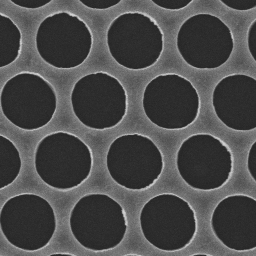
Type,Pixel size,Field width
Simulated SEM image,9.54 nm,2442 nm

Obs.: a regular array of holes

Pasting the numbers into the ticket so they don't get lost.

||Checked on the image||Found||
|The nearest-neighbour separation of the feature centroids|662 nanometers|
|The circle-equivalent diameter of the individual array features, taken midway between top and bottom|527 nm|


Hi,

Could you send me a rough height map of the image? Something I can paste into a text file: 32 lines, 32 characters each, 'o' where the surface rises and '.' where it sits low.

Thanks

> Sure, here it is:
oo....oooo.....ooooo....oooo....
oooooooooooooooooooooooooooooooo
.ooooo....oooo.....oooo.....oooo
..ooo......ooo......ooo.....ooo.
...oo......oo.......oo.......oo.
..ooo......ooo......oo.......oo.
..ooo......ooo......oo.......oo.
..oooo.....ooo......ooo.....oooo
oooooooooooooooo..oooooooooooooo
oo...oooooo...oooooo..ooooooo..o
o.....oooo.....oooo.....ooo.....
.......oo.......oo.......oo.....
.......oo.......oo.......oo.....
.......oo.......oo.......oo.....
o......ooo.....ooo......ooo.....
oo....ooooo...ooooo.....oooo....
oooooooooooooooooooooooooooooooo
.oooo.....oooo.....oooo....ooooo
..ooo......ooo......ooo.....ooo.
..oo.......oo.......oo.......oo.
...o.......oo.......oo.......oo.
..ooo......ooo......oo.......oo.
..ooo.....oooo.....oooo.....oooo
ooooooo..ooooooo..ooooooo..ooooo
oo...oooooo..ooooooo..ooooooo..o
o.....oooo.....ooo.....oooo.....
.......oo......ooo......ooo.....
.......oo.......oo......ooo.....
.......oo.......oo......ooo.....
o......oo.......oo......ooo.....
oo....oooo.....oooo....ooooo....
oooooooooooooooooooooooooooooooo